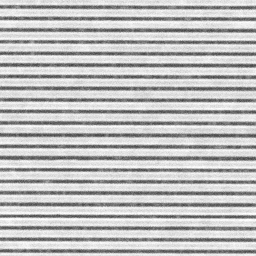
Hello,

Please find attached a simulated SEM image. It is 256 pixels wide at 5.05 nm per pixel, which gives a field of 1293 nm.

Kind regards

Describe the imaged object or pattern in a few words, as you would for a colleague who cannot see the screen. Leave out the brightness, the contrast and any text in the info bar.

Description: parallel lines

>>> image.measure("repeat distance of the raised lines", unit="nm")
58.7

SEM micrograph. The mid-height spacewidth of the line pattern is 24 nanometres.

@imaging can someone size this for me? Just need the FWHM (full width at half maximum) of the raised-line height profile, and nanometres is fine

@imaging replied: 33.5